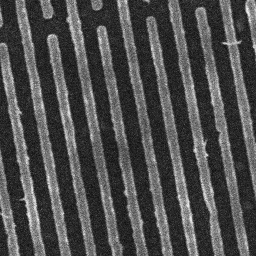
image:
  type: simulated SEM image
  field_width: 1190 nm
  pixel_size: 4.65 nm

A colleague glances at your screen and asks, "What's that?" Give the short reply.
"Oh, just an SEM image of parallel lines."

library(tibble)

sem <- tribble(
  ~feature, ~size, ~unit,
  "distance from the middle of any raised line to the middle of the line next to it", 0.117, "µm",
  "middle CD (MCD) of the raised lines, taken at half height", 0.0429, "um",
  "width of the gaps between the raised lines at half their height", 72.6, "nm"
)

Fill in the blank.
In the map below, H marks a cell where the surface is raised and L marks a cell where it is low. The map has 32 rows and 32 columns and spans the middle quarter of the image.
LLLLHHLLLLHHLLLLHHLLLLLHHLLLLHHH
LLLLHHLLLLHHLLLLHHHLLLLHHLLLLHHH
LLLLHHLLLLHHLLLLHHHLLLLHHLLLLHHH
LLLLHHLLLLHHHLLLLHHLLLLHHHLLLLHH
LLLLHHHLLLHHHLLLLHHLLLLLHHLLLLHH
HLLLLHHLLLLHHLLLLHHLLLLLHHLLLLHH
HLLLLHHLLLLHHLLLLHHHLLLLHHLLLLHH
HLLLLHHLLLLHHLLLLLHHLLLLHHLLLLHH
HLLLLHHLLLLHHHLLLLHHLLLLHHLLLLLH
HLLLLHHHLLLHHHLLLLHHLLLLHHHLLLLH
HLLLLHHHLLLLHHLLLLHHLLLLLHHLLLLH
HLLLLLHHLLLLHHLLLLHHLLLLLHHLLLLH
HHLLLLHHLLLLHHLLLLHHHLLLLHHLLLLH
HHLLLLHHLLLLHHHLLLLHHLLLLHHLLLLH
HHLLLLHHLLLLHHHLLLLHHLLLLHHHLLLL
HHLLLLHHHLLLHHHLLLLHHHLLLHHHLLLL
HHLLLLLHHLLLHHHLLLLHHHLLLLHHLLLL
HHLLLLLHHLLLLHHLLLLHHHLLLLHHLLLL
HHHLLLLHHLLLLHHHLLLLHHLLLLHHLLLL
LHHLLLLHHLLLLHHHLLLLHHLLLLHHLLLL
LHHLLLLHHLLLLLHHLLLLHHLLLLHHHLLL
LHHLLLLHHHLLLLHHLLLLHHLLLLLHHLLL
LHHLLLLHHHLLLLHHLLLLHHLLLLLHHLLL
LHHHLLLLHHLLLLHHLLLLHHHLLLLHHLLL
LLHHLLLLHHLLLLHHHLLLLHHLLLLHHLLL
LLHHLLLLHHLLLLHHHLLLLHHLLLLHHLLL
LLHHLLLLHHHLLLLHHLLLLHHLLLLLHHLL
LLHHLLLLHHHLLLLHHLLLLHHHLLLLHHLL
LLHHLLLLLHHLLLLHHLLLLHHHLLLLHHLL
LLHHHLLLLHHLLLLHHLLLLLHHLLLLHHLL
LLHHHLLLLHHLLLLHHHLLLLHHLLLLHHLL
LLLHHLLLLHHLLLLHHHLLLHHHLLLLHHHL